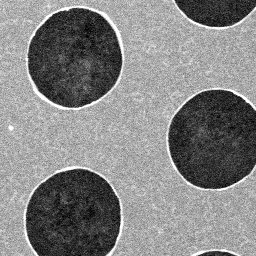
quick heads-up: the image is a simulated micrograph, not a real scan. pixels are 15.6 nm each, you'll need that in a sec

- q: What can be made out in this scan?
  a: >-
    holes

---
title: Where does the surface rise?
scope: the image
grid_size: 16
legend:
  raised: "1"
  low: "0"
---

1111111111100000
1110000111110001
1100000111111111
1100000011111111
1100000011111111
1100000111111111
1110001111110000
1111111111100000
1111111111000000
1111111111100000
1111111111100000
1110000111110001
1100000111111111
1100000011111111
1100000111111111
1100000111111111